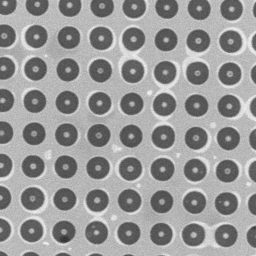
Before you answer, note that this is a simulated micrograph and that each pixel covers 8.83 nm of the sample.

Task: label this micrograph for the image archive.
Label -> an array of small figures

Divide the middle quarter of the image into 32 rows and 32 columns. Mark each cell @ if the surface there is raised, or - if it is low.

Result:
----@@------@@------@@@-----@@--
----@@------@@------@@------@@--
----@@------@@------@@------@@--
---@@@@----@@@@-----@@@-----@@@-
-@@@@@@@--@@@@@@---@@@@-----@@@-
@@@@@@@@@@@@@@@@@@@@@@@@@-@@@@@@
@@@@@@@@@@@@@@@@@@@@@@@@@@@@@@@@
---@@@@----@@@@----@@@@----@@@@@
---@@@------@@------@@@-----@@@-
----@@------@@------@@------@@--
----@@------@@------@@------@@--
---@@@@-----@@------@@------@@--
--@@@@@@---@@@@---@@@@@----@@@@-
@@@@@@@@@@@@@@@@@@@@@@@@@@@@@@@@
@@@@@@@@@@@@@@@@@@@@@@@@@@@@@@@@
---@@@@----@@@@---@@@@@----@@@@@
---@@@-----@@@-----@@@-----@@@@-
----@@--@---@@------@@------@@--
----@@-----@@@------@@------@@--
---@@@-----@@@-----@@@------@@--
-@@@@@@---@@@@@---@@@@@----@@@@-
@@@@@@@@@@@@@@@@@@@@@@@@@-@@@@@@
@@@@@@@@@@@@@@@@@@@@@@@@@@@@@@@@
--@@@@@---@@@@@---@@@@@---@@@@@@
---@@@-----@@@-----@@@-----@@@@-
@--@@-------@-------@@------@@--
---@@@------@-------@-------@@--
---@@@-----@@@------@@-----@@@--
--@@@@@---@@@@-----@@@-----@@@--
@@@@@@@@@@@@@@@@-@@@@@@@@@@@@@@@
@@@@@@@@@@@@@@@@@@@@@@@@@@@@@@@@
--@@@@@---@@@@@---@@@@@@-@@@@@@@